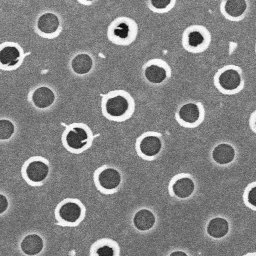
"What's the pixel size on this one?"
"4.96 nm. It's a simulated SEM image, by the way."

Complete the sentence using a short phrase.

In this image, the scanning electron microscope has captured a regular array of holes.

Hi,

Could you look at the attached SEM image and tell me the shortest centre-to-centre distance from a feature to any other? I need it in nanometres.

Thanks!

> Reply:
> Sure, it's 255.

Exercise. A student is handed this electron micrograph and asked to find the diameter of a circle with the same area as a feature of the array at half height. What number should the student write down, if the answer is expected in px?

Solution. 21.1